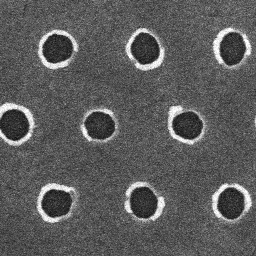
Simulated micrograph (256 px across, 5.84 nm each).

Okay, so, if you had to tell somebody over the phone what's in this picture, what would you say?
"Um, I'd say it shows a regular array of holes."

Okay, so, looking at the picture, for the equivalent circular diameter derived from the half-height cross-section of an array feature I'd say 0.179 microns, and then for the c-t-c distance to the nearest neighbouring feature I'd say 509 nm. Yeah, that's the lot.